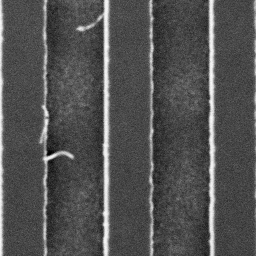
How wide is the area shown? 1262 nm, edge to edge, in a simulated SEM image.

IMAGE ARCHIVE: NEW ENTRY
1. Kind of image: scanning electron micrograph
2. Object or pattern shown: lines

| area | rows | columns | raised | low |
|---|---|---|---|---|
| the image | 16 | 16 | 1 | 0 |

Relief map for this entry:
1110000110000111
1110000111000111
1110000111000111
1110000111000111
1110000110000111
1110000111000111
1110000111000111
1110000111000111
1110000111000111
1110000110000111
1110000111000111
1110000111000111
1110000110000111
1110000111000111
1110000111000111
1110000111000111